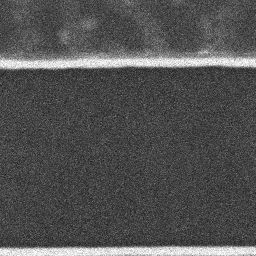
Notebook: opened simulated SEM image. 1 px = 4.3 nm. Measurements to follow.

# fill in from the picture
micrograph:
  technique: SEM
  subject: one or a few lines or trenches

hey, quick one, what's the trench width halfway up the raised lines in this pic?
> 0.808 microns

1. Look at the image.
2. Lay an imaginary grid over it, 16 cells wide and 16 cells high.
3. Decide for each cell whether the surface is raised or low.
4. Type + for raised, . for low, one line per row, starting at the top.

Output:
++++++++++++++++
++++++++++++++++
++++++++++++++++
++++++++++++++++
................
................
................
................
................
................
................
................
................
................
................
................